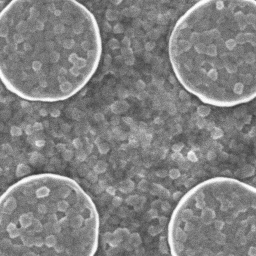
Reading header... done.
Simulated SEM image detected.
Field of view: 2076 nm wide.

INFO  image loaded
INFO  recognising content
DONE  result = raised bodies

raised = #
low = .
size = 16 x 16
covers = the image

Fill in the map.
#####.......####
######.....#####
######.....#####
######.....#####
######.....#####
.####.......####
................
................
................
................
................
.####........##.
######......####
######.....#####
######.....#####
######.....#####